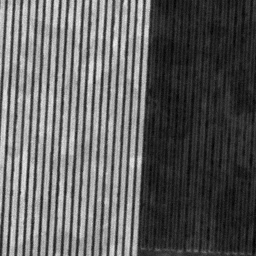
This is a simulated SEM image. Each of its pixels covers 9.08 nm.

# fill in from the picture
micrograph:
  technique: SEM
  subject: parallel lines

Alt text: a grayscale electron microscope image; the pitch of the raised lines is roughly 69.5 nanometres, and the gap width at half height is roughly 36.3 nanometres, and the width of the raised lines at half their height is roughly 0.0363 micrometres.